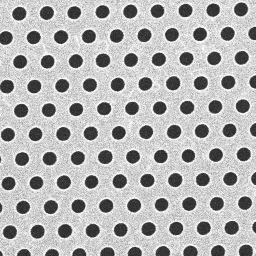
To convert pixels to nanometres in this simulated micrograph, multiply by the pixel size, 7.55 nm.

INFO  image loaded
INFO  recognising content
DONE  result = a regular array of holes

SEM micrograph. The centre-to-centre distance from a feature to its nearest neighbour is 207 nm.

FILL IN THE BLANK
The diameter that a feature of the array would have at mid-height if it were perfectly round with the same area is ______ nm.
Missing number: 106